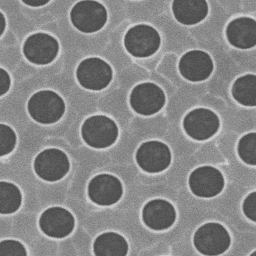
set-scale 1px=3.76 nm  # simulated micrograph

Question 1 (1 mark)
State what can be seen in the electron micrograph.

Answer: a regular array of holes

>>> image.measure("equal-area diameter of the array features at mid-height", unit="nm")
130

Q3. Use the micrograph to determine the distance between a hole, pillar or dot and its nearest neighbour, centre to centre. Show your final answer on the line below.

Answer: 218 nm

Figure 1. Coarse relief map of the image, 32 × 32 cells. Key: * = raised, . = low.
***...***....*********....******
*********....*********....******
.********....*********...****...
.*********...***...*********....
****..**********....********....
***....*********....*********...
***....*********...****...******
****...***...*********....******
**********....********.....*****
.*********....*********...****..
.*********....***..**********...
.****..*********....*********...
****....********.....********...
***.....********....*****.******
****....****.**********....*****
**********....*********.....****
..********.....********....*****
..********.....*********..****..
..**********.****....*********..
*****...*********....*********..
****.....********....**********.
****....**********..****....****
******.****....*********....****
..*********....*********....****
...********....**********..****.
...*********..****...*********..
..***....*********....********..
*****....*********....*********.
*****....**********..****...****
******..****...*********.....***
...*********....********.....***
...*********....*********...****